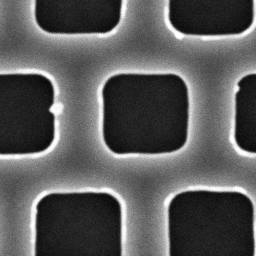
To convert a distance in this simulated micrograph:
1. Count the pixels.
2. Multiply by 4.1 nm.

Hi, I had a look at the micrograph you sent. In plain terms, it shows holes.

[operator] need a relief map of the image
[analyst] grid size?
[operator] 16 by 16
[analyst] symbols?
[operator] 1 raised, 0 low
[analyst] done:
1100000011100000
1100000111100000
1111111111111111
1111111111111111
1111111111111111
0001110000001110
0001110000001110
0001110000001110
0001110000001110
0011111000011111
1111111111111111
1111111111111111
1110000111100000
1100000011100000
1100000011100000
1100000011100000